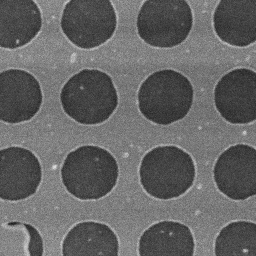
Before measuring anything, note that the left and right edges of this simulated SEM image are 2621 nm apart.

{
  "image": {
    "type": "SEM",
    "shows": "holes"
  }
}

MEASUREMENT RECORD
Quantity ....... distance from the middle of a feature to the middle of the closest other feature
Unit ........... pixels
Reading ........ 75.4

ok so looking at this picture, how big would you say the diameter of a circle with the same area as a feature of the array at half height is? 580 nm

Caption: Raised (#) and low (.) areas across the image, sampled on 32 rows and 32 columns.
.....###......####......###.....
.....###......###.......###.....
.....###.......##.......###.....
.....###.......##.......###.....
.....###......###.......###.....
...######....#####.....#####...#
################################
################################
##############################.#
....#####.....#####....#####....
.....###......####......###.....
.....###.......##.......###.....
.....###.......##.......###.....
.....###.......##.......###.....
....#####.....####.....#####....
##########..########.########..#
################################
################################
#..#######...######....#####....
....####......####......###.....
.....###.......###......###.....
.....###.......##........##.....
.....###.......###......###.....
.....###......####......###.....
....#####....######....#####....
################################
################################
################################
###.#####.....####......####....
####.###.......###......###.....
###..###.......##.......###.....
###..###.......##.......###.....